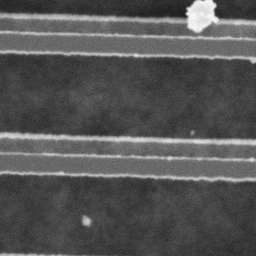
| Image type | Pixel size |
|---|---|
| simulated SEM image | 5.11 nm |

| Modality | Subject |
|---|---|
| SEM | lines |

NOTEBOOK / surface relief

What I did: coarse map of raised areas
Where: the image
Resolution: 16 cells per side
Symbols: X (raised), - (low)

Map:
------------X---
XXXXXXXXXXXXXXXX
XXXXXXXXXXXXXXXX
--------XXXXXXXX
----------------
----------------
----------------
----------------
----------------
XXXXXXXXXXXXXXXX
XXXXXXXXXXXXXXXX
----------------
----------------
----------------
----------------
----------------